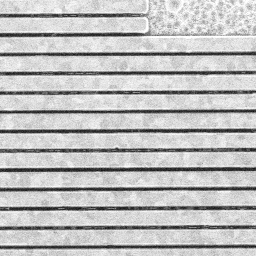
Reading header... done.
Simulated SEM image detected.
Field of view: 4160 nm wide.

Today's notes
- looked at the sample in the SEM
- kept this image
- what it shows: parallel lines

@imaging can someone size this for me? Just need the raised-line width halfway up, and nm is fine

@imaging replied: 232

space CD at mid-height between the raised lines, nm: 85.3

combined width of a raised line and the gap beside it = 314 nanometers